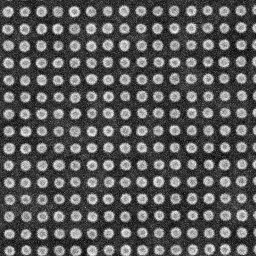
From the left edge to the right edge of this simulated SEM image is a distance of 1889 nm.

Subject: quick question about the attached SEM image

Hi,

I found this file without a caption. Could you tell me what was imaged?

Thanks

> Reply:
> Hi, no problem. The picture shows a regular array of raised bodies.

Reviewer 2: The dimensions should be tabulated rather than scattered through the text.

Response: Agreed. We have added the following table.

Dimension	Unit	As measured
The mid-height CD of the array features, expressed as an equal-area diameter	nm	68.2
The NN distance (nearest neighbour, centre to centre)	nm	120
